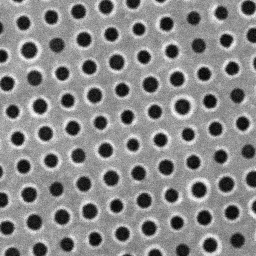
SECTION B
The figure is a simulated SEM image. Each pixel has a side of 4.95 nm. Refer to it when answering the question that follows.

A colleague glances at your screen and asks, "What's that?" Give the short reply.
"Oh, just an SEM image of a regular array of holes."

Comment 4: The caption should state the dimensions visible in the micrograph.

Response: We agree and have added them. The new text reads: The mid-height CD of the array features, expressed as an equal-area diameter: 73.6 nanometers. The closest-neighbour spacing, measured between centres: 137 nm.